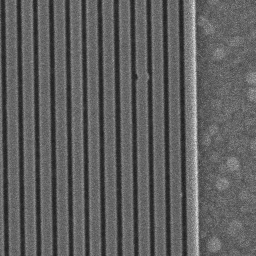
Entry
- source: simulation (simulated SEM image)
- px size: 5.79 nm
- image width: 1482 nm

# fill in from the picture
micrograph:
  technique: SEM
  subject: parallel lines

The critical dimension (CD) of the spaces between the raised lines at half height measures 31.8 nm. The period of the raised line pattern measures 16.2 pixels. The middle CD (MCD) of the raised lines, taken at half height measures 63.7 nm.